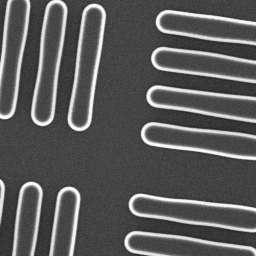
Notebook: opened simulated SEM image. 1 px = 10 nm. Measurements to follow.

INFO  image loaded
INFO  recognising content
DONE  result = groups of lines, slits or small figures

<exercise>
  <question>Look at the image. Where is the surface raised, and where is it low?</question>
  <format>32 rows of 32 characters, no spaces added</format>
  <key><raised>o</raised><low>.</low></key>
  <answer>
.ooo..oo........................
.oo...oo...oo........o..........
.oo...oo..ooo.......ooooooooo...
.oo..ooo..ooo.......oooooooooooo
.oo..ooo..ooo...........oooooooo
.oo..ooo..ooo...................
ooo..ooo..oo.......ooooo........
ooo..oo...oo.......oooooooooooo.
oo...oo...oo........oooooooooooo
oo...oo..ooo...............ooooo
oo...oo..ooo....................
oo..ooo..ooo.......oooooo.......
oo..ooo..ooo.......ooooooooooooo
oo..ooo..oo...........oooooooooo
o...ooo..oo................ooooo
.....o...oo.....................
..................oooooooooo....
..................oooooooooooooo
.......................ooooooooo
.............................ooo
................................
................................
................................
...oo...........................
...oo..ooo.......o..............
..ooo..ooo......ooooooooooo.....
..ooo..ooo.......ooooooooooooooo
..ooo..oo.............oooooooooo
..ooo..oo....................ooo
..oo...oo.......ooooo...........
..oo..ooo.......ooooooooooo.....
..oo..ooo........ooooooooooooooo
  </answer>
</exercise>